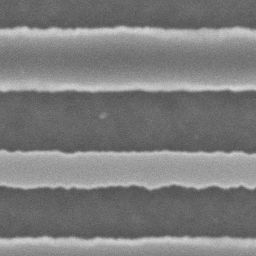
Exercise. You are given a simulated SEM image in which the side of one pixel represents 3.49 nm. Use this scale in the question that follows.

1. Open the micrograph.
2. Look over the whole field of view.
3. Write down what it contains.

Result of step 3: lines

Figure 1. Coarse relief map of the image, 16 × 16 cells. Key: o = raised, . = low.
................
................
oooooooooooooooo
oooooooooooooooo
oooooooooooooooo
oooooooooooooooo
................
................
................
o.o.......o.....
oooooooooooooooo
oooooooooooooooo
................
................
................
oooooooooooooooo